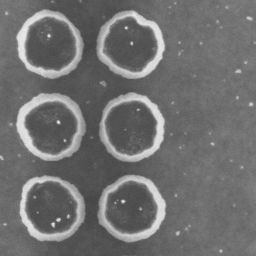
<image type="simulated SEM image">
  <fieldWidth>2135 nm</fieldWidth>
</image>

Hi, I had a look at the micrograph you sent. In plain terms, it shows raised bodies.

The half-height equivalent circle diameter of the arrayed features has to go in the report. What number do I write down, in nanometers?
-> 506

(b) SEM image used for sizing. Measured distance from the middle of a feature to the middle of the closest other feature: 0.665 micrometres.